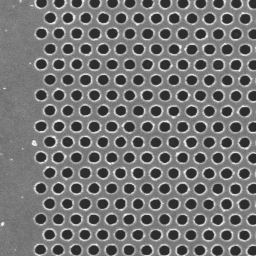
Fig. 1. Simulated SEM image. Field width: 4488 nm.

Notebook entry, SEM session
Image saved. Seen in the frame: a regular array of holes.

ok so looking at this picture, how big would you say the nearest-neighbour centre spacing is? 0.305 micrometres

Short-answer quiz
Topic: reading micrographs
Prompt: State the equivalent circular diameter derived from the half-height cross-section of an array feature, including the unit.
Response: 0.185 microns